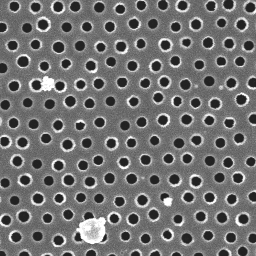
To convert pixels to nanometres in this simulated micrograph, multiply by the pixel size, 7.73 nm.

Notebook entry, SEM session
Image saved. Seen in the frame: a regular array of holes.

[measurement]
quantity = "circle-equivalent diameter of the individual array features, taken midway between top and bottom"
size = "75.5 nm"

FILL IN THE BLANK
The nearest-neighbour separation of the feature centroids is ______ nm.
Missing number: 147